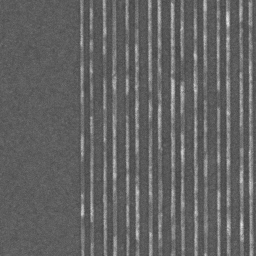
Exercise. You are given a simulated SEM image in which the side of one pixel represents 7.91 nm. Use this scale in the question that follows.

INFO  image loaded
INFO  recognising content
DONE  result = parallel lines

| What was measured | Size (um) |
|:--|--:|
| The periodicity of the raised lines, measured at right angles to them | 0.0888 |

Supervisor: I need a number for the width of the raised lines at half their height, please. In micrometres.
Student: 0.0217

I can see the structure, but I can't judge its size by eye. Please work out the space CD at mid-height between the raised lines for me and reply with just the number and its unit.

53.4 nm